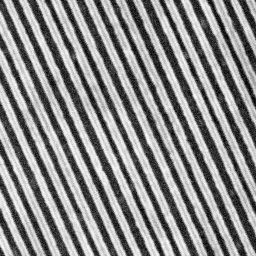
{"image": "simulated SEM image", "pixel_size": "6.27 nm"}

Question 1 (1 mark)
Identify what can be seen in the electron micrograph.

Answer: parallel lines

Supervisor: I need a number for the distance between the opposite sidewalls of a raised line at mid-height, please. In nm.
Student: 33.6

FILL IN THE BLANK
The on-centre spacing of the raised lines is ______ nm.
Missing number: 92.7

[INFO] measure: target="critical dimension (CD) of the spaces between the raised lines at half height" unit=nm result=55.8